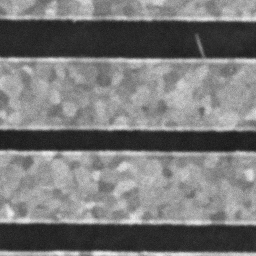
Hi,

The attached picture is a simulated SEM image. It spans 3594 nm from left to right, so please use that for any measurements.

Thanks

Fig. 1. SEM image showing lines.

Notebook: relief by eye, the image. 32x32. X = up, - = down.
XXXXXXXXXXXXXXXXXXXXXXXXXXXXXXXX
XXXXXXXXXXXXXXXXXXXXXXXXXXXXXXXX
--------------------------------
--------------------------------
--------------------------------
--------------------------------
--------------------------------
XXXXXXXXXXXXXXXXXX-X------------
XXXXXXXXXXXXXXXXXXXXXXXXXXXXXXXX
XXXXXXXXXXXXXXXXXXXXXXXXXXXXXXXX
XXXXXXXXXXXXXXXXXXXXXXXXXXXXXXXX
XXXXXXXXXXXXXXXXXXXXXXXXXXXXXXXX
XXXXXXXXXXXXXXXXXXXXXXXXXXXXXXXX
XXXXXXXXXXXXXXXXXXXXXXXXXXXXXXXX
XXXXXXXXXXXXXXXXXXXXXXXXXXXXXXXX
XXXXXXXXXXXXXXXXXXXXXXXXXXXXXXXX
--------------------------------
--------------------------------
--------------------------------
XXXXXXXXXXXXXXXXXXXXXXXXXXXXXXXX
XXXXXXXXXXXXXXXXXXXXXXXXXXXXXXXX
XXXXXXXXXXXXXXXXXXXXXXXXXXXXXXXX
XXXXXXXXXXXXXXXXXXXXXXXXXXXXXXXX
XXXXXXXXXXXXXXXXXXXXXXXXXXXXXXXX
XXXXXXXXXXXXXXXXXXXXXXXXXXXXXXXX
XXXXXXXXXXXXXXXXXXXXXXXXXXXXXXXX
XXXXXXXXXXXXXXXXXXXXXXXXXXXXXXXX
XXXXXXXXXXXXXXXXXXXXXXXXXXXXXXXX
--------------------------------
--------------------------------
--------------------------------
--------------------------------